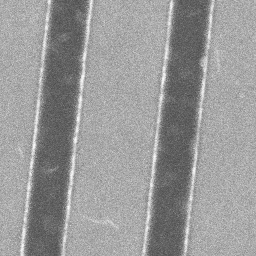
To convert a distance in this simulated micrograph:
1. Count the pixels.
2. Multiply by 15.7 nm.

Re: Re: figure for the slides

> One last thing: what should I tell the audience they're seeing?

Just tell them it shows one or a few lines or trenches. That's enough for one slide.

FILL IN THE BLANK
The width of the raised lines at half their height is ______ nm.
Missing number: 664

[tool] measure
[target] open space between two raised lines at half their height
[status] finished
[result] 1230 nm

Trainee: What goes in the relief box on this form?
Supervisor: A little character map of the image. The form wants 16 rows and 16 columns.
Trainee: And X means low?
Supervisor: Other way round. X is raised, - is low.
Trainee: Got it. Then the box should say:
---XXX-----XX---
---XXX-----XX---
---XX-----XXX---
---XX-----XXX---
---XX-----XXX---
--XXX-----XXX---
--XXX-----XXX---
--XXX-----XXX---
--XXX-----XX----
--XXX-----XX----
--XXX-----XX----
--XX-----XXX----
--XX-----XXX----
--XX-----XXX----
-XXX-----XXX----
-XXX-----XXX----